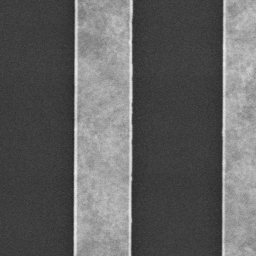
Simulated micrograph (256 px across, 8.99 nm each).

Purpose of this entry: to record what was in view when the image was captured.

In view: one or a few lines or trenches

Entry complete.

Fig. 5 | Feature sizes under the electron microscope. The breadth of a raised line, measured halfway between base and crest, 498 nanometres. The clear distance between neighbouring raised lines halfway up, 0.837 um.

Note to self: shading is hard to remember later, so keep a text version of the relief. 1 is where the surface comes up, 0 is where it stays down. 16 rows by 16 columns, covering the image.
0000011100000011
0000011100000011
0000011100000011
0000011100000011
0000011100000011
0000011100000011
0000011100000011
0000011100000011
0000011100000011
0000011100000011
0000011100000011
0000011100000011
0000011100000011
0000011100000011
0000011100000011
0000011100000011